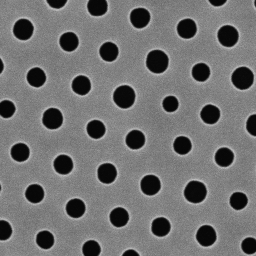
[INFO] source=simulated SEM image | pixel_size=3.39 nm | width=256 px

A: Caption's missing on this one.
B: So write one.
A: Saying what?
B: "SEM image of a regular array of holes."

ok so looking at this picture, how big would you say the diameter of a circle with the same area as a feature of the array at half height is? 0.0659 micrometres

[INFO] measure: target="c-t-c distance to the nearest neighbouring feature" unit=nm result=146